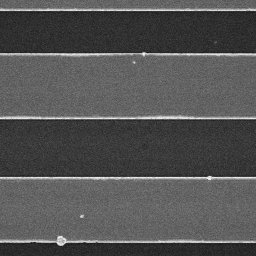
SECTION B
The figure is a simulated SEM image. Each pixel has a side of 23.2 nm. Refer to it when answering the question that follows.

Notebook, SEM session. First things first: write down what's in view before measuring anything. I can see lines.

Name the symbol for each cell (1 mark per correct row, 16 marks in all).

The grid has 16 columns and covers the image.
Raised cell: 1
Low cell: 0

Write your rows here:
1111111111111111
0000000000000000
0000000000000000
1111111111111111
1111111111111111
1111111111111111
1111111111111111
0000000000000000
0000000000000000
0000000000000000
0000000000000000
1111111111111111
1111111111111111
1111111111111111
1111111111111111
0000000000000000